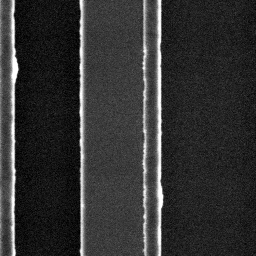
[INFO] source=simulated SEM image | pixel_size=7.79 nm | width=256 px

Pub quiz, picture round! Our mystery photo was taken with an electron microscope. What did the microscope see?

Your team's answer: lines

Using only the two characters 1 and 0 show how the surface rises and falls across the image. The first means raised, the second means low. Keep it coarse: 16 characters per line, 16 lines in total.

1000011111000000
1000011111000000
1000011111000000
1000011111000000
1000011111000000
1000011111000000
1000011111000000
1000011111000000
1000011111000000
1000011111000000
1000011111000000
1000011111000000
1000011111000000
1000011111000000
1000011111000000
1000011111000000